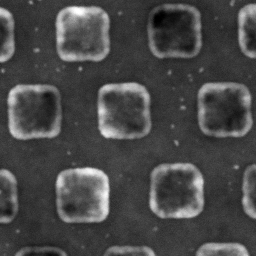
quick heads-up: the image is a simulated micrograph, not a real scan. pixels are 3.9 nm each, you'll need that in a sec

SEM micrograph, raised bodies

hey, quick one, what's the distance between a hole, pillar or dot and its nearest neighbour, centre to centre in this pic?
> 361 nanometers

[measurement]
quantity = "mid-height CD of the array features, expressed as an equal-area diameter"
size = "0.21 µm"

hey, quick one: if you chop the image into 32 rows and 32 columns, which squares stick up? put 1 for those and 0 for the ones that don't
00000000000000000000000000000000
10000000111110000001111110000011
10000001111110000001111110000011
10000001111110000001111110000011
10000001111110000001111110000011
11000001111110000001111110000011
10000001111110000001111100000001
00000000000000000000000000000000
00000000000000000000000000000000
00000000000000000000000000000000
00000000000000000000000000000000
00111110000001111100000001111110
01111110000001111100000001111110
01111110000001111100000001111110
01111110000001111110000001111110
01111110000001111110000001111110
00111110000001111100000000111110
00000000000000000000000000000000
00000000000000000000000000000000
00000000000000000000000000000000
00000000000000000000000000000000
00000000111100000001111110000001
11000001111110000001111110000001
11000001111110000001111110000001
11000001111110000001111110000001
11000001111110000001111110000001
11000000111110000000111110000001
00000000011100000000000000000000
00000000000000000000000000000000
00000000000000000000000000000000
00000000000000000000000000000000
00011111000000111110000001111110